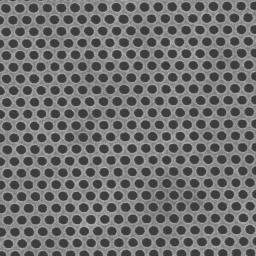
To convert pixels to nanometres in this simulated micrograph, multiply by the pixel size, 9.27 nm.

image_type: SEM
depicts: a regular array of holes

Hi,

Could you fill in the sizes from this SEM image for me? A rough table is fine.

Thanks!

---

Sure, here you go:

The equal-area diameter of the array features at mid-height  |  0.0869 microns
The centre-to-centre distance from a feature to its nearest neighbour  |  124 nm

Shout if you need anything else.